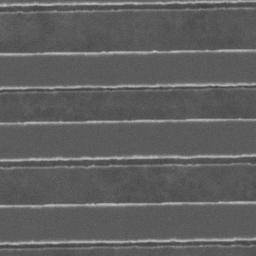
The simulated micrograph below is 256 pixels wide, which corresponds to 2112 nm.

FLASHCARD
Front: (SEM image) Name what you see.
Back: lines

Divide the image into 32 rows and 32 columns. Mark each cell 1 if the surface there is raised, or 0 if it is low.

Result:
11111111111111111100000000000000
00000000000000000000000000000000
00000000000000000000000000000000
00000000000000000000000000000000
00000000000000000000000000000000
00000000000000000000000000000000
00000000000000000001011111111111
11111111111111111111111111111111
11111111111111111111111111111111
11111111111111111111111111111111
11111111111111111111111111111111
00000000000000000000000000000000
00000000000000000000000000000000
00000000000000000000000000000000
00000000000000000000000000000000
11111111111111111111111111111111
11111111111111111111111111111111
11111111111111111111111111111111
11111111111111111111111111111111
11111111111111111111111111111111
00000000000000000000000000000000
00000000000000000000000000000000
00000000000000000000000000000000
00000000000000000000000000000000
00000000000000000000000000000000
00000000000000000000111111111111
11111111111111111111111111111111
11111111111111111111111111111111
11111111111111111111111111111111
11111111111111111111111111111111
11100000000000000000000000000000
00000000000000000000000000000000